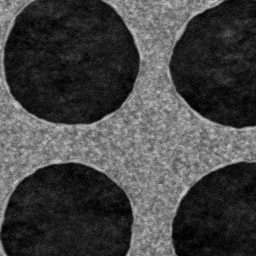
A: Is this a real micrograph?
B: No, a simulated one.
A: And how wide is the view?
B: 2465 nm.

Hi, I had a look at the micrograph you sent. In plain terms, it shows holes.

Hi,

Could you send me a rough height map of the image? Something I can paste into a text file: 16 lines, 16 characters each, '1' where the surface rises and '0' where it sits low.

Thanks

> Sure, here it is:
1000000111111000
1000000011110000
0000000011100000
0000000001100000
0000000001100000
1000000011100000
1000000011110000
1110001111111000
1111111111111111
1111111111111111
1110001111111100
1000000111110000
0000000011100000
0000000011100000
0000000011100000
0000000011100000